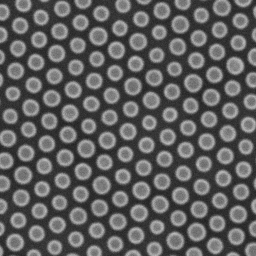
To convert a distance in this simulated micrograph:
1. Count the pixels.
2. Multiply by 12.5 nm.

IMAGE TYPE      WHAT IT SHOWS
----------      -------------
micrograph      a regular array of raised bodies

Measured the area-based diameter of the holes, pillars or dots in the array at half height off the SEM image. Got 0.185 microns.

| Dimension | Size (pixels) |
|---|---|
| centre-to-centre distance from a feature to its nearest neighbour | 22.2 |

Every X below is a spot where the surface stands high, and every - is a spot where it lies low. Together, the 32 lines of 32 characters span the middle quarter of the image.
-XXXX-----------XXXX------XXX---
-XXXX------XXX---XX-------XXX---
--X----X---XXXX------XXX---XX---
------XXX---XX-------XXX-------X
------XXX-------XXX--XXX------XX
-XXX--XXX------XXXX-------XX--XX
-XXX-------XX---XXX------XXXX--X
-XXX------XXXX--XX---XX--XXXX---
------XX--XXXX------XXXX--XX----
-----XXXX--XX-------XXXX------XX
-X---XXXX------XXX---XX-------XX
XXX---XX-------XXX-------XXX--XX
XXX-------XXX---XX-------XXX----
XXX-------XXX-------XX---XXX----
-----XX---XXX-------XXX-------XX
-----XXX-------XX---XXX------XXX
XX---XXX------XXXX-----------XXX
XXX-------XX--XXXX------XXXX--XX
XXX------XXXX--XX-------XXXX----
X---XXX--XXXX------XXX---XX-----
----XXX--XXX-------XXX-------XXX
----XXXX------XXX--XXX-------XXX
XX--XXX-------XXX-------XX---XXX
XX-------XX---XXX------XXXX-----
XX------XXXX-------XX--XXXX-----
---XXX---XXX------XXXX----------
---XXXX-----------XXXX------XXX-
---XXX-------XXX---XX-------XXXX
X---XX---X---XXX-------XXX---XX-
X-------XXX---XX-------XXX------
X------XXXX-------XXX--XXX------
---XX---XXX------XXXX-------XX--